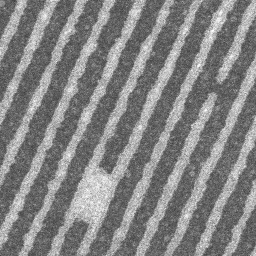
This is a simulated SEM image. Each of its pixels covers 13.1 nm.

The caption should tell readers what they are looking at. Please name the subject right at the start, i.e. parallel lines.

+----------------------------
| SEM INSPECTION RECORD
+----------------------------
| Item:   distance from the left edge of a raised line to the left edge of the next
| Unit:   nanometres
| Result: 346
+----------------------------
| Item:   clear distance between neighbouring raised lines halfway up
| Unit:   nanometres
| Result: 88.9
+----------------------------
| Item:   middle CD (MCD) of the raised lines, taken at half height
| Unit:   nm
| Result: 251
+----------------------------